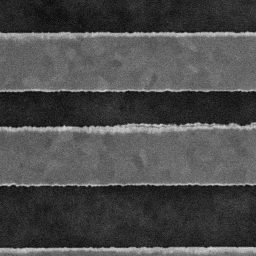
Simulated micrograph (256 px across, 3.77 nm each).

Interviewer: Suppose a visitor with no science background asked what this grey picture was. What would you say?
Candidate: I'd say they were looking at lines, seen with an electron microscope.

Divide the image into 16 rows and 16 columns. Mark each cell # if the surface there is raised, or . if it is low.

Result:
................
................
################
################
################
################
................
................
################
################
################
################
................
................
................
................